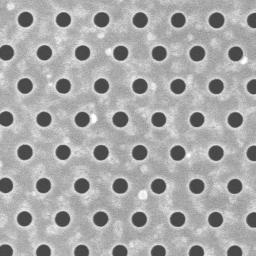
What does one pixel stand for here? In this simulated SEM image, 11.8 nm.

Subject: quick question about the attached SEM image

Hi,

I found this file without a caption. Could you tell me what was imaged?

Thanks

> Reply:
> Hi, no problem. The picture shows a regular array of holes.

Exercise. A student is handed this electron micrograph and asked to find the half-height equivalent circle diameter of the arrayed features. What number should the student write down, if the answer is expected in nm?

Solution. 187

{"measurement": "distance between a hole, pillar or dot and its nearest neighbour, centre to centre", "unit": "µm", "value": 0.449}